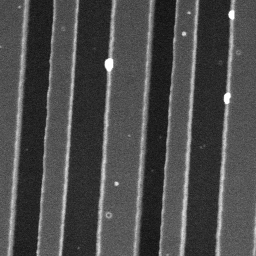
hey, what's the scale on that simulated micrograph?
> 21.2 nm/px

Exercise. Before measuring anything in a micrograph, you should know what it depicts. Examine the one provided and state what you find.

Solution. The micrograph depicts lines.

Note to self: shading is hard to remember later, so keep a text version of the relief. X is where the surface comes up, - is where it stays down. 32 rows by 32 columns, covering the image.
XXX----XXX----XXXXX---XXX----XXX
XXX----XXX----XXXXX---XXX----XXX
XXX----XXX----XXXXX---XXX----XXX
XXX----XXX----XXXXX---XX-----XXX
XXX----XX-----XXXXX---XX-----XXX
XXX---XXX-----XXXXX---XX-----XXX
XXX---XXX-----XXXXX---XX-----XXX
XXX---XXX----XXXXX----XX-----XXX
XXX---XXX----XXXXX----XX-----XXX
XXX---XXX-----XXXX---XXX-----XXX
XXX---XXX-----XXXX---XXX-----XXX
XX----XXX-----XXXX---XXX----XXXX
XX----XXX-----XXXX---XXX----XXXX
XX----XXX----XXXXX---XXX----XXXX
XX----XXX----XXXXX---XXX----XXXX
XX----XXX----XXXXX---XXX----XXXX
XX----XXX----XXXXX---XXX----XXXX
XX----XXX----XXXXX---XXX----XXXX
XX----XXX----XXXXX---XXX----XXXX
XX---XXX-----XXXXX---XX-----XXXX
XX---XXX-----XXXXX---XX-----XXXX
XX---XXX-----XXXXX---XX-----XXXX
XX---XXX-----XXXX----XX-----XXXX
XX---XXX-----XXXX----XX-----XXXX
XX---XXX-----XXXX---XXX-----XXXX
XX---XXX-----XXXX---XXX-----XXXX
X----XXX-----XXXX---XXX-----XXXX
X----XXX-----XXXX---XXX----XXXXX
X----XXX----XXXXX---XXX----XXXXX
X----XXX----XXXXX---XXX----XXXXX
X----XXX----XXXXX---XXX----XXXXX
X----XXX----XXXXX---XXX----XXXXX